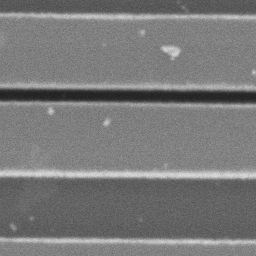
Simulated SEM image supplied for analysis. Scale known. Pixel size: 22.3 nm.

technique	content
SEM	lines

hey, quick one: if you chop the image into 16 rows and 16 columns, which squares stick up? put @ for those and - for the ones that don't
----------------
@@@@@@@@@@@@@@@@
@@@@@@@@@@@@@@@@
@@@@@@@@@@@@@@@@
@@@@@@@@@@@@@@@@
@@@@@@@@@@@@@@@@
@@@@@@@@@@@@@@@@
@@@@@@@@@@@@@@@@
@@@@@@@@@@@@@@@@
@@@@@@@@@@@@@@@@
@@@@@@@@@@@@@@@@
----------------
----------------
----------------
----------------
@@@@@@@@@@@@@@@@